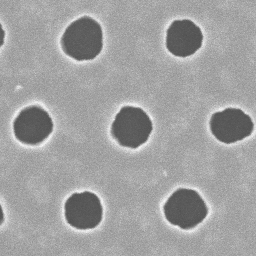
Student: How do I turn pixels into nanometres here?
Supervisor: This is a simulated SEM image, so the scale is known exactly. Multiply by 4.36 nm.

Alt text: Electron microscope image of holes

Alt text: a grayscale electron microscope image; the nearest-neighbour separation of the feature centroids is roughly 96.3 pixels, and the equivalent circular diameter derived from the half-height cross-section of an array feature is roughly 169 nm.